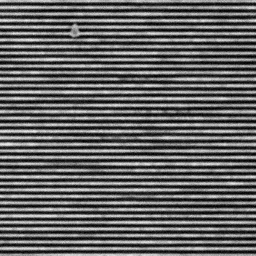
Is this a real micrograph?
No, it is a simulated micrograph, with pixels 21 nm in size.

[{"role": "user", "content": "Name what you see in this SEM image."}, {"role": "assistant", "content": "parallel lines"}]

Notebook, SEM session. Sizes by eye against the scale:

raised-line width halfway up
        36.7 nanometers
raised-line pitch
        136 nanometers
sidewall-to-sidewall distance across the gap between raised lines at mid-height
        4.5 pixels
